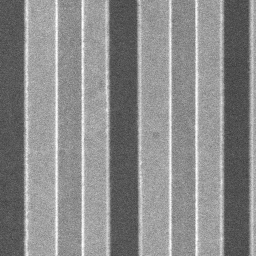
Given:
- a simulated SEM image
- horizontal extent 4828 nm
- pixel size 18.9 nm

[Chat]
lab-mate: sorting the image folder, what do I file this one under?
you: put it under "lines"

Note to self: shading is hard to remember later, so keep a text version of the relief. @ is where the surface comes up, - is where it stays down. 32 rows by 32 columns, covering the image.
---@@@@@@@@@@----@@@@@@@@@@@----
---@@@@@@@@@@----@@@@@@@@@@@----
---@@@@@@@@@@-----@@@@@@@@@@----
---@@@@@@@@@@-----@@@@@@@@@@----
---@@@@@@@@@@-----@@@@@@@@@@----
---@@@@@@@@@@-----@@@@@@@@@@----
---@@@@@@@@@@-----@@@@@@@@@@----
---@@@@@@@@@@-----@@@@@@@@@@----
---@@@@@@@@@@-----@@@@@@@@@@----
---@@@@@@@@@@-----@@@@@@@@@@----
---@@@@@@@@@@-----@@@@@@@@@@----
---@@@@@@@@@@-----@@@@@@@@@@----
---@@@@@@@@@@-----@@@@@@@@@@----
---@@@@@@@@@@-----@@@@@@@@@@----
---@@@@@@@@@@-----@@@@@@@@@@----
---@@@@@@@@@@-----@@@@@@@@@@----
---@@@@@@@@@@-----@@@@@@@@@@----
---@@@@@@@@@@-----@@@@@@@@@@----
---@@@@@@@@@@-----@@@@@@@@@@----
---@@@@@@@@@@-----@@@@@@@@@@----
---@@@@@@@@@@-----@@@@@@@@@@----
---@@@@@@@@@@-----@@@@@@@@@@----
---@@@@@@@@@@-----@@@@@@@@@@----
---@@@@@@@@@@-----@@@@@@@@@@----
---@@@@@@@@@@-----@@@@@@@@@@----
---@@@@@@@@@@-----@@@@@@@@@@----
---@@@@@@@@@@-----@@@@@@@@@@----
---@@@@@@@@@@-----@@@@@@@@@@----
---@@@@@@@@@@-----@@@@@@@@@@----
---@@@@@@@@@@-----@@@@@@@@@@----
---@@@@@@@@@@-----@@@@@@@@@@----
---@@@@@@@@@@-----@@@@@@@@@@----